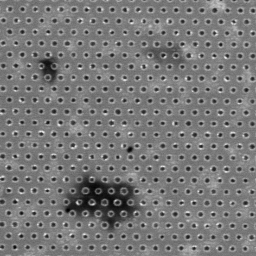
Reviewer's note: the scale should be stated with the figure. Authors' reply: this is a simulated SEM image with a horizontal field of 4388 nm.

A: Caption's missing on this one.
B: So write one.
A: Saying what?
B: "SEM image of a regular array of holes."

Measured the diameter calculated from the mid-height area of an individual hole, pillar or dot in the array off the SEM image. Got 83.2 nanometers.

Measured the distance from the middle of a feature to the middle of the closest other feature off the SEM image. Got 214 nm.